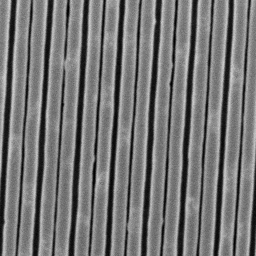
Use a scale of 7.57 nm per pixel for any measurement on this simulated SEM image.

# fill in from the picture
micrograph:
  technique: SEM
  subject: parallel lines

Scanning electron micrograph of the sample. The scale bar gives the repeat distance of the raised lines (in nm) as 136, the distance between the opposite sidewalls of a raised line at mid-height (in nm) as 103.